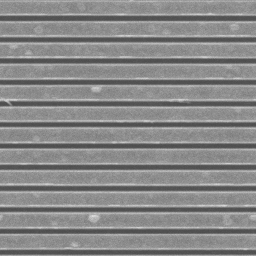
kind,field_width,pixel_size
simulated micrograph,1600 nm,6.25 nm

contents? parallel lines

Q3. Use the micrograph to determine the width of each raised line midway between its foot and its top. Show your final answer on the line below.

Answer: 96.2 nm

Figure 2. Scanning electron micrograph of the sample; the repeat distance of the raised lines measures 133 nanometres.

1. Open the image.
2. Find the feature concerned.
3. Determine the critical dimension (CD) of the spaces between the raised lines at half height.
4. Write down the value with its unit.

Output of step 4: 0.0375 microns